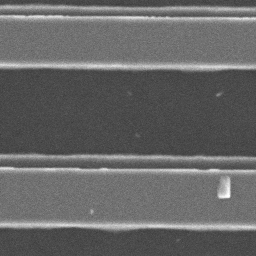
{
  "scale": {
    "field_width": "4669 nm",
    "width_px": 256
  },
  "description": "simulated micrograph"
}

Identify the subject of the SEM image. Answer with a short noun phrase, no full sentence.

lines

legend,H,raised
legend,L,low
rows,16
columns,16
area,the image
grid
HHLLLLLLLLLLLLLL
HHHHHHHHHHHHHHHH
HHHHHHHHHHHHHHHH
HHHHHHHHHHHHHHHH
LLLLLLLLLLLLLLLL
LLLLLLLLLLLLLLLL
LLLLLLLLLLLLLLLL
LLLLLLLLLLLLLLLL
LLLLLLLLLLLLLLLL
LLLLLLLLLLLLLLLL
HHHHHHHHHHHHHHHH
HHHHHHHHHHHHHHHH
HHHHHHHHHHHHHHHH
HHHHHHHHHHHHHHHH
LLLLLLLLLLLLLLLL
LLLLLLLLLLLLLLLL